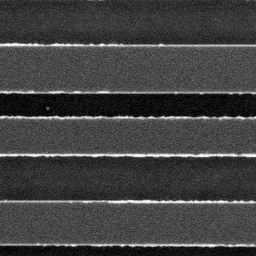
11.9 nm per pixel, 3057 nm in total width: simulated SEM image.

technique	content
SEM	lines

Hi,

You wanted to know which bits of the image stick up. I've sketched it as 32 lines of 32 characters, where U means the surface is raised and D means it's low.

DDDDDDDDDDDDDDDDDDDDDDDDDDDDDDDD
DDDDDDDDDDDDDDDDDDDDDDDDDDDDDDDD
DDDDDDDDDDDDDDDDDDDDDDDDDDDDDDDD
DDDDDDDDDDDDDDDDDDDDDDDDDDDDDDDD
DDDDDDDDDDDDDDDDDDDDDDDDDDDDDDDD
DDDDDDDDDDDDDDDDDDDDDDDDDDDDDDDD
UUUUUUUUUUUUUUUUUUUUUUUUUUUUUUUU
UUUUUUUUUUUUUUUUUUUUUUUUUUUUUUUU
UUUUUUUUUUUUUUUUUUUUUUUUUUUUUUUU
UUUUUUUUUUUUUUUUUUUUUUUUUUUUUUUU
UUUUUUUUUUUUUUUUUUUUUUUUUUUUUUUU
UUUUUUUUUUUUUUUUUUUUUUUUUUUUUUUU
DDDDDDDDDDDDDDDDDDDDDDDDDDDDDDDD
DDDDDDDDDDDDDDDDDDDDDDDDDDDDDDDD
DDDDDDDDDDDDDDDDDDDDDDDDDDDDDDDD
UUUUUUUUUUUUUUUUUUUUUUUUUUUUUUUU
UUUUUUUUUUUUUUUUUUUUUUUUUUUUUUUU
UUUUUUUUUUUUUUUUUUUUUUUUUUUUUUUU
UUUUUUUUUUUUUUUUUUUUUUUUUUUUUUUU
DDDDDDDDDDDDDDDDDDDDDDDDDDDDDDDD
DDDDDDDDDDDDDDDDDDDDDDDDDDDDDDDD
DDDDDDDDDDDDDDDDDDDDDDDDDDDDDDDD
DDDDDDDDDDDDDDDDDDDDDDDDDDDDDDDD
DDDDDDDDDDDDDDDDDDDDDDDDDDDDDDDD
DDDDDDDDDDDDDDDDDDDDDDDDDDDDDDDD
UUUUUUUUUUUUUUUUUUUUUUUUUUUUUUUU
UUUUUUUUUUUUUUUUUUUUUUUUUUUUUUUU
UUUUUUUUUUUUUUUUUUUUUUUUUUUUUUUU
UUUUUUUUUUUUUUUUUUUUUUUUUUUUUUUU
UUUUUUUUUUUUUUUUUUUUUUUUUUUUUUUU
UUUUUUUUUUUUUUUUUUUUUUUUUUUUUUUU
DDDDDDDDDDDDDDDDDDDDDDDDDDDDDDDD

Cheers